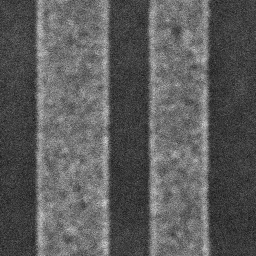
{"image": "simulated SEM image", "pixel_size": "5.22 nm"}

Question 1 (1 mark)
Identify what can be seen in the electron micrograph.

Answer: one or a few lines or trenches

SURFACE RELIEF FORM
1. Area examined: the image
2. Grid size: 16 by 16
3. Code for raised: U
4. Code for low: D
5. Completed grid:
DDDUUUUDDDUUUDDD
DDDUUUUDDDUUUDDD
DDDUUUUDDDUUUDDD
DDDUUUUDDDUUUDDD
DDDUUUUDDDUUUDDD
DDDUUUUDDDUUUDDD
DDDUUUUDDDUUUDDD
DDDUUUUDDDUUUDDD
DDDUUUUDDDUUUDDD
DDDUUUUDDDUUUDDD
DDDUUUUDDDUUUDDD
DDDUUUUDDDUUUDDD
DDDUUUUDDDUUUDDD
DDDUUUUDDDUUUDDD
DDDUUUUDDDUUUDDD
DDDUUUUDDDUUUDDD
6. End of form